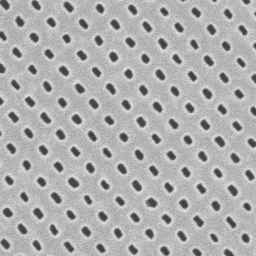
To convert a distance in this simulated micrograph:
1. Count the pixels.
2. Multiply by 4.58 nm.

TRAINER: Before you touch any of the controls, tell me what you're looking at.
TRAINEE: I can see a regular array of holes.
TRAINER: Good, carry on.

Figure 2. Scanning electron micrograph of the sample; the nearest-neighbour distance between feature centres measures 101 nm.